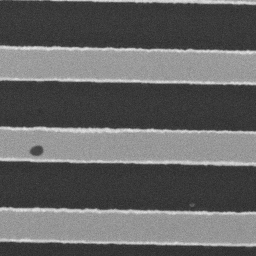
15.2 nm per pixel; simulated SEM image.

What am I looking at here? lines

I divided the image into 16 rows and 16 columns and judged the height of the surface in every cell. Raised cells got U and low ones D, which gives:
DDDDDDDDDDDDDDDD
DDDDDDDDDDDDDDDD
DDDDDDDDDDDDDDDD
UUUUUUUUUUUUUUUU
UUUUUUUUUUUUUUUU
DDDDDDDDDDDDDDDD
DDDDDDDDDDDDDDDD
DDDDDDDDDDDDDDDD
UUUUUUUUUUUUUUUU
UUUUUUUUUUUUUUUU
DDDDDDDDDDDDDDDD
DDDDDDDDDDDDDDDD
DDDDDDDDDDDDDDDD
UUUUUUUUUUUUUUUU
UUUUUUUUUUUUUUUU
DDDDDDDDDDDDDDDD